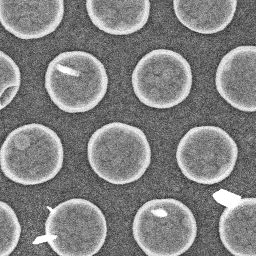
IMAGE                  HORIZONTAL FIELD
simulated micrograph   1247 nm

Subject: raised bodies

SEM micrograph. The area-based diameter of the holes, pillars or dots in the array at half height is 287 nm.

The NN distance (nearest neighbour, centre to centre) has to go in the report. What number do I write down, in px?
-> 86